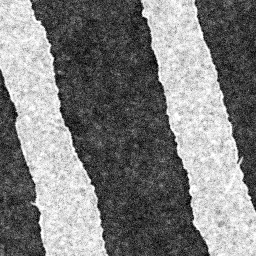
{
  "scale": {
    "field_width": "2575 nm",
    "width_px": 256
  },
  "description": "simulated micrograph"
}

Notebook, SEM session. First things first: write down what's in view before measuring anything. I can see one or a few lines or trenches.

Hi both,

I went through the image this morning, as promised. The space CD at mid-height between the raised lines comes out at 1.02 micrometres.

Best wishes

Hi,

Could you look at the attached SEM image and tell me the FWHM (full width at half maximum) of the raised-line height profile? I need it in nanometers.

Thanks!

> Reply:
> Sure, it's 537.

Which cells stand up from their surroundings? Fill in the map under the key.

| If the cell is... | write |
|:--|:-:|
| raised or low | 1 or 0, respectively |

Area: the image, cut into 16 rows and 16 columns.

1100000001110000
1100000001110000
1110000000111000
1110000000111000
1110000000111000
1111000000111100
0111000000111100
0111000000011100
0111000000011110
0111100000011110
0011100000001110
0011110000001110
0011110000001111
0001110000001111
0001110000001111
0001111000000111